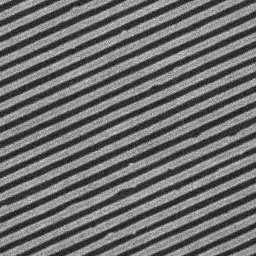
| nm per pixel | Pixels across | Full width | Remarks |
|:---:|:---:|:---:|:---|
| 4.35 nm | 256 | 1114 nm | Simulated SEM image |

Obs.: parallel lines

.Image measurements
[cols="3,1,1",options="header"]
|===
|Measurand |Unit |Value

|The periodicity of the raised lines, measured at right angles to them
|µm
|0.0599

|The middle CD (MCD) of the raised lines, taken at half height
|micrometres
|0.0297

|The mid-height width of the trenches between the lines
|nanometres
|29.7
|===